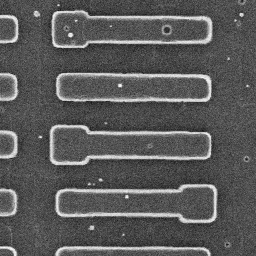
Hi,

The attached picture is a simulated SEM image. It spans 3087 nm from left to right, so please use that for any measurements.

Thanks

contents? wiring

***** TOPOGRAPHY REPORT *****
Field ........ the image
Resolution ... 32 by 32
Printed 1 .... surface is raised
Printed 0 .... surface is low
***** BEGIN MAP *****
00000000000000000000000000000000
00000001111000000000000000000000
11000001111111111111111111000000
11000001111111111111111111000000
11000001111111111111111111000000
00000001111000000000000000000000
00000000000000000000000000000000
00000000000000000000000000000000
00000000000000000000000000000000
11000001111111111111111110000000
11000001111111111111111111000000
11000001111111111111111111000000
00000000111111111101111111000000
00000000000000000000000000000000
00000000000000000000000000000000
00000000000000000000000000000000
10000011111100000000000000000000
11000011111111111111111111000000
11000011111111111111111111000000
10000011111111111111111111000000
00000000000000000000000000000000
00000000000000000000000000000000
00000000000000000000000000000000
00000000000000000000000111100000
11000001111111111111111111100000
11000001111111111111111111100000
11000001111111111111111111100000
00000000000000000000000111100000
00000000000000000000000000000000
00000000000000000000000000000000
00000000000000000000000000000000
11000001111111111111111111000000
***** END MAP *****